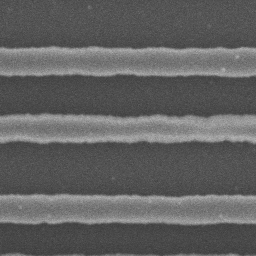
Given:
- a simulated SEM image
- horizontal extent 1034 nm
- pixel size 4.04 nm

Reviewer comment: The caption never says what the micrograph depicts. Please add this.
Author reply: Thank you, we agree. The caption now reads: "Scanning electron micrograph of lines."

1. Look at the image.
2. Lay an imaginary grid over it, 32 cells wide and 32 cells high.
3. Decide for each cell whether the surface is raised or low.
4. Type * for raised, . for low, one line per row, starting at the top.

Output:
................................
................................
................................
................................
................................
................................
********************************
********************************
********************************
............................***.
................................
................................
................................
................................
.*********......................
********************************
********************************
************************.***.***
................................
................................
................................
................................
................................
................................
*************.***.......*.****..
********************************
********************************
********************************
................................
................................
................................
................................